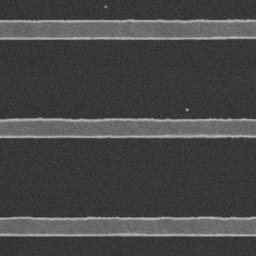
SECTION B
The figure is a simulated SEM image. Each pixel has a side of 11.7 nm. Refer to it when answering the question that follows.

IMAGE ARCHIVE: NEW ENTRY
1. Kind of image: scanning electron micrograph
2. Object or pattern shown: lines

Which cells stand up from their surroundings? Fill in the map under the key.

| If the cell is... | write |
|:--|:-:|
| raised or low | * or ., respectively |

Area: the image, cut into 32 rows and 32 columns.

................................
................................
................................
********************************
********************************
................................
................................
................................
................................
................................
................................
................................
................................
................................
................................
********************************
********************************
................................
................................
................................
................................
................................
................................
................................
................................
................................
................................
********************************
********************************
................................
................................
................................